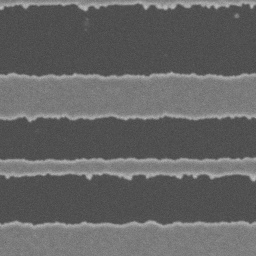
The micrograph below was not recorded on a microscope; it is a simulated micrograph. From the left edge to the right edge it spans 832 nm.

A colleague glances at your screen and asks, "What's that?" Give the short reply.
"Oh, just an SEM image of lines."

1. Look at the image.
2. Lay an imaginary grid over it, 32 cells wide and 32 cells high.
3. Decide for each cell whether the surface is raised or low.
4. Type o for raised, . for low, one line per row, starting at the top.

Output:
oooooooooooooooooooooooooooooo.o
................................
................................
................................
................................
................................
................................
................................
................................
ooooooooooooo.oooooooooooooo.ooo
oooooooooooooooooooooooooooooooo
oooooooooooooooooooooooooooooooo
oooooooooooooooooooooooooooooooo
oooooooooooooooooooooooooooooooo
oooooooooooooooooooooooooooooooo
................................
................................
................................
................................
................................
oooooooooooooooooooooooooooooooo
oooooooooooooooooooooooooooooooo
................................
................................
................................
................................
................................
................................
oooooooooooooooooooooooooooooooo
oooooooooooooooooooooooooooooooo
oooooooooooooooooooooooooooooooo
oooooooooooooooooooooooooooooooo